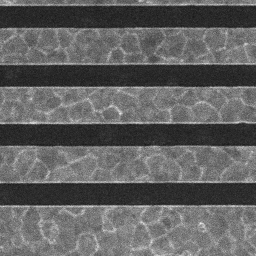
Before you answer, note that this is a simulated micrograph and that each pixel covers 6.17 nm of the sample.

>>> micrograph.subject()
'parallel lines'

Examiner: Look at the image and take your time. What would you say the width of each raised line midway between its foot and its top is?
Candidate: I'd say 218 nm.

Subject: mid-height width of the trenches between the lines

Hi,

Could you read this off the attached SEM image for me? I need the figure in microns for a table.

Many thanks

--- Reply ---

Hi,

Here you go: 0.146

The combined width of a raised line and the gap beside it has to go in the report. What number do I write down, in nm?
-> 365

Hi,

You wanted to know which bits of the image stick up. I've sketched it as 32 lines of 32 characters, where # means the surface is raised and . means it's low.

################################
................................
................................
................................
################################
################################
################################
################################
................................
................................
................................
################################
################################
################################
################################
................................
................................
................................
################################
################################
################################
################################
################################
................................
................................
................................
################################
################################
################################
################################
################################
################################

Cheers